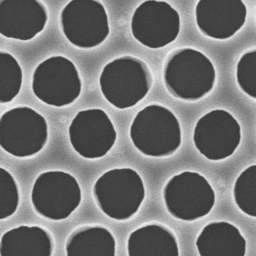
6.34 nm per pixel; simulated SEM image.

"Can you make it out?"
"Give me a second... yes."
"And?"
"a regular array of holes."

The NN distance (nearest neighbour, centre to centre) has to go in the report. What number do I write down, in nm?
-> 399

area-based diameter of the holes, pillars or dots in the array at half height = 311 nanometres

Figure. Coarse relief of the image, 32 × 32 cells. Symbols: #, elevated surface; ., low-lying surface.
.....####....#####...####.....##
......##.....####.....##.......#
......##.....###......###......#
.....###......##.......##.....##
#...####.....####.....####...###
#########...######...###########
######################...######.
..####...#####...####.....####..
...##....####.....###......###..
...#......###......##......###..
...#......###......##......###..
..##......###.....###.....#####.
.####....####.....##############
##..##############...###########
.....#####...####.....###....###
......###.....###.....###.....##
......###.....##......##......##
......###.....##.......#......##
.....####.....###.....###.....##
##..######...######.######...###
################################
.#####..#####....#############..
..###....###......###.....####..
..##......##......###.....###...
..##......##......###......##...
..##......##......###......###..
..###....####....####.....#####.
#######################.########
##...######..#####..######...###
......###.....##......###.....##
......##......##......###......#
......##......##......###......#